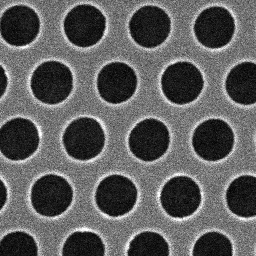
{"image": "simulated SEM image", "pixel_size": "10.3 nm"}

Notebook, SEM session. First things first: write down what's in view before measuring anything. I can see a regular array of holes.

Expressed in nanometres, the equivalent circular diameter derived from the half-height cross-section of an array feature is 436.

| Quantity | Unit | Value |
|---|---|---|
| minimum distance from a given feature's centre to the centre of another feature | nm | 664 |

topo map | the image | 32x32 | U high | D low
UUUUUUUUUUDUUUUUUUUUUUUUUUUUUUUU
UDDDUUUUUDDDDUUUUDDDDUUUUDDDDUUU
DDDDDUUUDDDDDUUUDDDDDUUUUDDDDUUU
DDDDDUUUDDDDDUUUDDDDDUUUDDDDDUUU
DDDDDUUUDDDDDUUUDDDDDUUUDDDDDUUU
UDDDUUUUUDDDUUUUUDDDUUUUUDDDUUUU
UUUUUUUUUUUUUUUUUUUUUUUUUUUUUUUU
UUUUUUUUUUUUUUUUUUUUUUUUUUUUUUUU
UUUUUDDDDUUUUDDDUUUUUDDDDUUUUDDD
DUUUDDDDDUUUDDDDDUUUDDDDDUUUDDDD
DUUUDDDDDUUUDDDDDUUUDDDDDUUUDDDD
DUUUDDDDDUUUDDDDDUUUDDDDDUUUDDDD
UUUUUDDDUUUUUDDDUUUUUDDDUUUUUDDD
UUUUUUUUUUUUUUUUUUUUUUUUUUUUUUUU
UUUUUUUUUUUUUUUUUUUUUUUUUUUUUUUU
UDDDUUUUUDDDUUUUUDDDDUUUUDDDUUUU
DDDDDUUUDDDDDUUUDDDDDUUUDDDDDUUU
DDDDDUUUDDDDDUUUDDDDDUUUDDDDDUUU
DDDDDUUUDDDDDUUUDDDDDUUUDDDDDUUU
UDDDUUUUUDDDUUUUUDDDUUUUUDDDUUUU
UUUUUUUUUUUUUUUUUUUUUUUUUUUUUUUU
UUUUUUUUUUUUUUUUUUUUUUUUUUUUUUUU
UUUUUDDDUUUUUDDDUUUUUDDDUUUUUDDD
DUUUDDDDDUUUDDDDDUUUDDDDDUUUDDDD
DUUUDDDDDUUUDDDDDUUUDDDDDUUUDDDD
DUUUDDDDDUUUDDDDDUUUDDDDDUUUDDDD
UUUUUDDDUUUUUDDDUUUUUDDDUUUUUDDD
UUUUUUUUUUUUUUUUUUUUUUUUUUUUUUUU
UUUUUUUUUUUUUUUUUUUUUUUUUUUUUUUU
UDDDUUUUUDDDUUUUUDDDUUUUUDDDUUUU
DDDDDUUUDDDDDUUUDDDDDUUUDDDDDUUU
DDDDDUUUDDDDDUUUDDDDDUUUDDDDDUUU